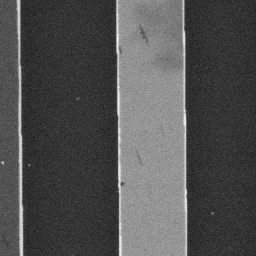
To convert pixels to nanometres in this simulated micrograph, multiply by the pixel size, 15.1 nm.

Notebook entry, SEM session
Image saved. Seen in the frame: lines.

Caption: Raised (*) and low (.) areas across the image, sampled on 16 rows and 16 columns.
*......****.....
*......****.....
*......*****....
*......*****....
*......*****....
*......*****....
*......*****....
*......*****....
*......*****....
*......*****....
*......*****....
*......*****....
*......*****....
*......*****....
*......*****....
*......*****....